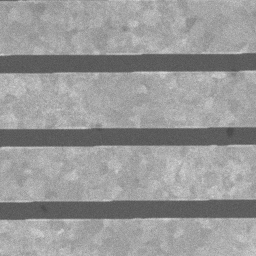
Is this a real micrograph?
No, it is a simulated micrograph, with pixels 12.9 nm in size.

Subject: lines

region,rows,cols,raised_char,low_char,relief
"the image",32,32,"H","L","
HHHHHHHHHHHHHHHHHHHHHHHHHHHHHHHH
HHHHHHHHHHHHHHHHHHHHHHHHHHHHHHHH
HHHHHHHHHHHHHHHHHHHHHHHHHHHHHHHH
HHHHHHHHHHHHHHHHHHHHHHHHHHHHHHHH
HHHHHHHHHHHHHHHHHHHHHHHHHHHHHHHH
HHHHHHHHHHHHHHHHHHHHHHHHHHHHHHHH
HHHHHHHHHHHHHHHHHHHHHHHHHHHHHHHH
LLLLLLLLLLLLLLLLLLLLLLLLLLLLLLLL
LLLLLLLLLLLLLLLLLLLLLLLLLLLLLLLL
HHHHHHHHHHHHHHHHHHHHHHHHHHHHHHHH
HHHHHHHHHHHHHHHHHHHHHHHHHHHHHHHH
HHHHHHHHHHHHHHHHHHHHHHHHHHHHHHHH
HHHHHHHHHHHHHHHHHHHHHHHHHHHHHHHH
HHHHHHHHHHHHHHHHHHHHHHHHHHHHHHHH
HHHHHHHHHHHHHHHHHHHHHHHHHHHHHHHH
HHHHHHHHHHHHHHHHHHHHHHHHHHHHHHHH
LLLLLLLLLLLLLLLLLLLLLLLLLLLLLLLL
LLLLLLLLLLLLLLLLLLLLLLLLLLLLLLLL
HHHHHHHHHHHHHHHHHHHHHHHHHHHHHHHH
HHHHHHHHHHHHHHHHHHHHHHHHHHHHHHHH
HHHHHHHHHHHHHHHHHHHHHHHHHHHHHHHH
HHHHHHHHHHHHHHHHHHHHHHHHHHHHHHHH
HHHHHHHHHHHHHHHHHHHHHHHHHHHHHHHH
HHHHHHHHHHHHHHHHHHHHHHHHHHHHHHHH
HHHHHHHHHHHHHHHHHHHHHHHHHHHHHHHH
LLLLLLLLLLLLLLLLLLLLLLLLLLLLLLLL
LLLLLLLLLLLLLLLLLLLLLLLLLLLLLLLL
LLLHHHHHHHHHHHHHHHHHHHHHHHHHHHHH
HHHHHHHHHHHHHHHHHHHHHHHHHHHHHHHH
HHHHHHHHHHHHHHHHHHHHHHHHHHHHHHHH
HHHHHHHHHHHHHHHHHHHHHHHHHHHHHHHH
HHHHHHHHHHHHHHHHHHHHHHHHHHHHHHHH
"